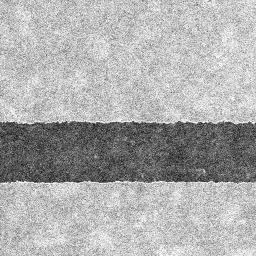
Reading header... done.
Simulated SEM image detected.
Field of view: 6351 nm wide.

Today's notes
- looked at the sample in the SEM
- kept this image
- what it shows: one or a few lines or trenches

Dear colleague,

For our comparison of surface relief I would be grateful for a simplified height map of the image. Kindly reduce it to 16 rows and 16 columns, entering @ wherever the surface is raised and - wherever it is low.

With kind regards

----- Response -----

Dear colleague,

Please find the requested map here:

@@@@@@@@@@@@@@@@
@@@@@@@@@@@@@@@@
@@@@@@@@@@@@@@@@
@@@@@@@@@@@@@@@@
@@@@@@@@@@@@@@@@
@@@@@@@@@@@@@@@@
@@@@@@@@@@@@@@@@
@@@@@@@@@@@@@@@@
----------------
----------------
----------------
@@@@@@@@@@@@@@@@
@@@@@@@@@@@@@@@@
@@@@@@@@@@@@@@@@
@@@@@@@@@@@@@@@@
@@@@@@@@@@@@@@@@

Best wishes